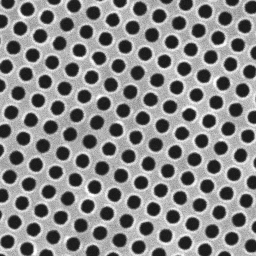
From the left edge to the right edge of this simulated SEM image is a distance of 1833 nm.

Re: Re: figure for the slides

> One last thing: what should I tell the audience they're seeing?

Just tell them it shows a regular array of holes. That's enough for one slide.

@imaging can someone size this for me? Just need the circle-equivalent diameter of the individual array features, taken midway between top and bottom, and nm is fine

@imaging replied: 105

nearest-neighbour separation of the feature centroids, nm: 145